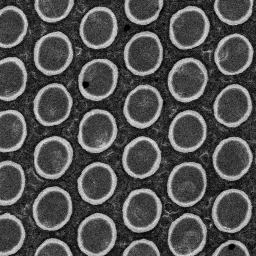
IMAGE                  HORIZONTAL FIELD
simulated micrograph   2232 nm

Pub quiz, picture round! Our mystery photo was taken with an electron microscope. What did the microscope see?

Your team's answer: a regular array of raised bodies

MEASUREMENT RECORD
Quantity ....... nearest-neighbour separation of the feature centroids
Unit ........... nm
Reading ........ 447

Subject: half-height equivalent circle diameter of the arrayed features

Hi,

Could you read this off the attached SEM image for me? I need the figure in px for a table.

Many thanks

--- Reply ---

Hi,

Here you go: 38.3